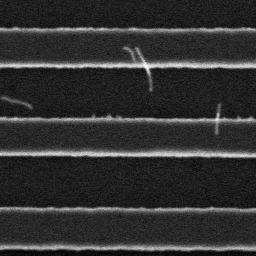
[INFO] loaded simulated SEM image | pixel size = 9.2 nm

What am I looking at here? lines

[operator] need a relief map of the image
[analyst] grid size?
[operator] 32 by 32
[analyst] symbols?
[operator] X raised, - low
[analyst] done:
--------------------------------
--------------------------------
--------------------------------
--------------------------------
XXXXXXXXXXXXXXXXXXXXXXXXXXXXXXXX
XXXXXXXXXXXXXXXXXXXXXXXXXXXXXXXX
XXXXXXXXXXXXXXXXXXXXXXXXXXXXXXXX
XXXXXXXXXXXXXXXXXXXXXXXXXXXXXXXX
--------------------------------
--------------------------------
--------------------------------
--------------------------------
--------------------------------
--------------------------------
--------------------------------
XXXXXXXXXXXXXXXXXXXXXXXXXXXXXXXX
XXXXXXXXXXXXXXXXXXXXXXXXXXXXXXXX
XXXXXXXXXXXXXXXXXXXXXXXXXXXXXXXX
XXXXXXXXXXXXXXXXXXXXXXXXXXXXXXXX
-------------------------------X
--------------------------------
--------------------------------
--------------------------------
--------------------------------
--------------------------------
--------------------------------
XXXXXXXXXXXXXXXXXXXXXXXXXXXXXXXX
XXXXXXXXXXXXXXXXXXXXXXXXXXXXXXXX
XXXXXXXXXXXXXXXXXXXXXXXXXXXXXXXX
XXXXXXXXXXXXXXXXXXXXXXXXXXXXXXXX
XXXXXXXXXXXXXXXXXXXXXXXXXXXXXXXX
--------------------------------